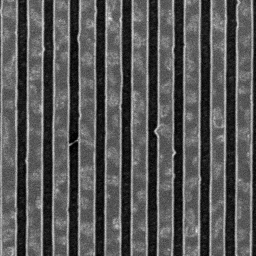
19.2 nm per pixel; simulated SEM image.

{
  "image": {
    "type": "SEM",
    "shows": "parallel lines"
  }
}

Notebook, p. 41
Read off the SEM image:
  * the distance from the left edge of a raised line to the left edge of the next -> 502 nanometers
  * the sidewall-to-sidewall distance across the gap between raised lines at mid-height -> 209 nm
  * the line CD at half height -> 295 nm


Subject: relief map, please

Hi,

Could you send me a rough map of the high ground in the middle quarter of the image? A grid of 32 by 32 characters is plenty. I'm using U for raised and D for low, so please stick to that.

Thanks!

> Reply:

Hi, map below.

UDDDUUUUDDDUUUDDDUUUUDDDUUUDDDUU
UDDDUUUUDDDUUUDDDUUUUDDDUUUDDDUU
UDDDUUUUDDDUUUDDDUUUUDDDUUUDDDUU
UDDDUUUUDDDUUUDDDUUUUDDDUUUDDDUU
UDDDUUUUDDDUUUDDDUUUUDDDUUUDDDUU
UDDDUUUUDDDUUUDDDUUUUDDDUUUDDDUU
UDDDUUUUDDUUUUDDDUUUUDDDUUUDDDUU
UDDDUUUUDDUUUUDDDUUUUDDDUUUDDDUU
UDDDUUUUDDDUUUDDDUUUUDDDUUUDDDUU
UDDDUUUUDDDUUUDDDUUUUDDDUUUDDDUU
UDDDUUUUDDDUUUDDDUUUUDDDUUUDDDUU
UDDDUUUUDDDUUUDDDUUUUDDDUUUDDDUU
UDDDUUUUDDDUUUDDDUUUUDDDUUUDDDUU
UDDDUUUUDDDUUUDDDUUUUDDDUUUDDDUU
UDDDUUUUDDDUUUDDDUUUUDDDUUUDDDUU
UDDDUUUUDDDUUUDDDUUUUDDUUUUDDDUU
UDDDUUUUDDDUUUDDDUUUUDDUUUUDDDUU
UDDDUUUUDDDUUUDDDUUUUDDUUUUDDDUU
UDDDUUUUDDDUUUDDDUUUUDDUUUUDDDUU
UDDDUUUUDDDUUUDDDUUUUDDDUUUDDDUU
UDDDUUUUDDUUUUDDDUUUUDDDUUUDDDUU
UDDDUUUUDDUUUUDDDUUUUDDDUUUDDDUU
UDDDUUUUDDDUUUDDDUUUUDDDUUUDDDUU
UDDDUUUUDDUUUUDDDUUUUDDDUUUDDDUU
UDDDUUUUDDDUUUDDDUUUUDDUUUUDDDUU
UDDDUUUUDDDUUUDDDUUUUDDUUUUDDDUU
UDDDUUUUDDDUUUDDDUUUUDDUUUUDDDUU
UDDDUUUUDDDUUUDDDUUUUDDDUUUDDDUU
UDDDUUUUDDDUUUDDDUUUUDDDUUUDDDUU
UDDDUUUUDDUUUUDDDUUUUDDDUUUDDDUU
UDDDUUUUDDUUUUDDDUUUUDDDUUUDDDUU
UDDDUUUUDDUUUUDDDUUUUDDUUUUDDDUU